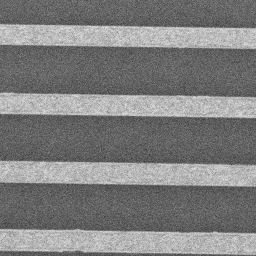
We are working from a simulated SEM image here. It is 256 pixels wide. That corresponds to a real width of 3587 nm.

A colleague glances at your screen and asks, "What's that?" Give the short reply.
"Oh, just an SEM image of one or a few lines or trenches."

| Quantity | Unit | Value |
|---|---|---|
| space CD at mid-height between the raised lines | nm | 679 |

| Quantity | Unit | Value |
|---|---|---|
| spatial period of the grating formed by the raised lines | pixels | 68.5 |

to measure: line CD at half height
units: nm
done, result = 277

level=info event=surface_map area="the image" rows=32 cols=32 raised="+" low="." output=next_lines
................................
................................
................................
+++++++++++++++++++.............
++++++++++++++++++++++++++++++++
....++++++++++++++++++++++++++++
................................
................................
................................
................................
................................
................................
++++++++++++++++++++++++++++++++
++++++++++++++++++++++++++++++++
..........................++++++
................................
................................
................................
................................
................................
+++++++++++++++.................
++++++++++++++++++++++++++++++++
++++++++++++++++++++++++++++++++
................................
................................
................................
................................
................................
................................
++++++++++++++++++++++++++++++++
++++++++++++++++++++++++++++++++
......................++++++++++